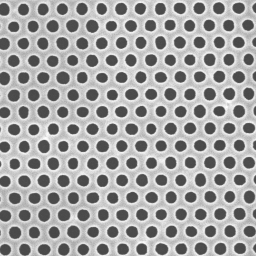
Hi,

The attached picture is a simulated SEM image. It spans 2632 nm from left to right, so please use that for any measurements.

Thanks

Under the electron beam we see a regular array of holes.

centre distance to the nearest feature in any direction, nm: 199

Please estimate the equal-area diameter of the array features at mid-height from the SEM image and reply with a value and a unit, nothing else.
123 nm